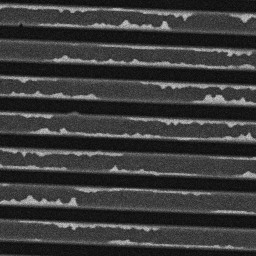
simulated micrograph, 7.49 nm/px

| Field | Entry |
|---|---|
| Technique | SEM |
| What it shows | parallel lines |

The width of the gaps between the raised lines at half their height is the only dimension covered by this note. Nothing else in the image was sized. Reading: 0.107 um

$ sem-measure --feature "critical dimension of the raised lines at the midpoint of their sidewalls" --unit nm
164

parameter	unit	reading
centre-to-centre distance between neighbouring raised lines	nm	269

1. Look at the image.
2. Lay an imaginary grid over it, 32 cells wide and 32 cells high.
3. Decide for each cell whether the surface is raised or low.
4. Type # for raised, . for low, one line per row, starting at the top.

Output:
#...............................
##########################......
################################
..........######################
................................
#############...................
################################
################################
.........................#######
................................
#########################.......
################################
...........#####################
................................
############....................
################################
################################
........................########
#...............................
###########################.....
################################
..........######################
................................
#############...................
################################
################################
......................##########
................................
##########################......
################################
............####################
................................